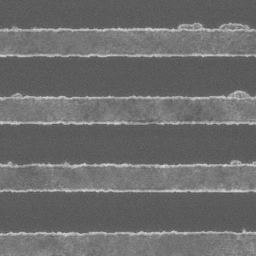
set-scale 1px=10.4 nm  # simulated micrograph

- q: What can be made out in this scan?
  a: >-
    lines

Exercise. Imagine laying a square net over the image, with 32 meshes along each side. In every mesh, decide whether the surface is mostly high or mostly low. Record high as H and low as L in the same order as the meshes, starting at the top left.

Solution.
LLLLLLLLLLLLLLLLLLLLLLLLLLLLLLLL
LLLLLLLLLLLLLLLLLLLLLLLLLLLLLLLL
LLLLLLLLLLLLLLLLLLLLLLLLLLLLLLLL
LLLLLLLLLLLLLLLLLLLLLLLLHLLLHHLL
HHHHHHHHHHHHHHHHHHHHHHHHHHHHHHHH
HHHHHHHHHHHHHHHHHHHHHHHHHHHHHHHH
HHHHHHHHHHHHHHHHHHHHHHHHHHHHHHHH
LLLLLLLLLLLLLLLLLLLLLLLLLLLLLLLL
LLLLLLLLLLLLLLLLLLLLLLLLLLLLLLLL
LLLLLLLLLLLLLLLLLLLLLLLLLLLLLLLL
LLLLLLLLLLLLLLLLLLLLLLLLLLLLLLLL
LLLLLLLLLLLLLLLLLLLLLLLLLLLLLLLL
HHHHHHHHHHHHHHHHHHHHHHHHHHHHHHHH
HHHHHHHHHHHHHHHHHHHHHHHHHHHHHHHH
HHHHHHHHHHHHHHHHHHHHHHHHHHHHHHHH
LLLLLLLLLLLLLLLHHHHLLHLLLLHLLLLH
LLLLLLLLLLLLLLLLLLLLLLLLLLLLLLLL
LLLLLLLLLLLLLLLLLLLLLLLLLLLLLLLL
LLLLLLLLLLLLLLLLLLLLLLLLLLLLLLLL
LLLLLLLLLLLLLLLLLLLLLLLLLLLLLLLL
LLLLLLLLLLLLLLLLLLLLLLLLLLLLLLLL
HHHHHHHHHHHHHHHHHHHHHHHHHHHHHHHH
HHHHHHHHHHHHHHHHHHHHHHHHHHHHHHHH
HHHHHHHHHHHHHHHHHHHHHHHHHHHHHHHH
LLLLLLLLLLLLLLLLLLLLLLLLLLLLLLLL
LLLLLLLLLLLLLLLLLLLLLLLLLLLLLLLL
LLLLLLLLLLLLLLLLLLLLLLLLLLLLLLLL
LLLLLLLLLLLLLLLLLLLLLLLLLLLLLLLL
LLLLLLLLLLLLLLLLLLLLLLLLLLLLLLLL
HHHHHHHHHHHHHHHHHHHHHHHHHHHHHHHH
HHHHHHHHHHHHHHHHHHHHHHHHHHHHHHHH
HHHHHHHHHHHHHHHHHHHHHHHHHHHHHHHH